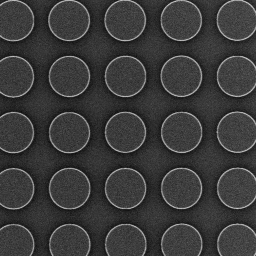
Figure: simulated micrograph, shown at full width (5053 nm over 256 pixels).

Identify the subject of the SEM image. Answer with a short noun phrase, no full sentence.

an array of small figures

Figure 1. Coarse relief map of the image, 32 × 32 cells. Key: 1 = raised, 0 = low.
11100001110000111000011100001110
11110011111001111100111110011111
11110011111001111100111110011111
11110011111001111100111110011111
11100001110000111000011100001110
00000000000000000000000000000000
00000000000000000000000000000000
11100001110000111000011100001110
11110011111001111100111110011111
11110011111001111100111110011111
11110011111001111100111110011111
11100001110000111000011100001110
00000000000000000000000000000000
00000000000000000000000000000000
11100001110000111000011100001110
11110011111001111100111110011111
11110011111001111100111110011111
11110011111001111100111110011111
11100001110000111000011100001110
00000000000000000000000000000000
00000000000000000000000000000000
11100001110000111000011100001110
11110011111001111100111110011111
11110011111001111100111110011111
11110011111001111100111110011111
11100001110000111000011100001110
00000000000000000000000000000000
00000000000000000000000000000000
11100001110000111000011100001110
11110011111001111100111110011111
11110011111001111100111110011111
11110011111001111100111110011111